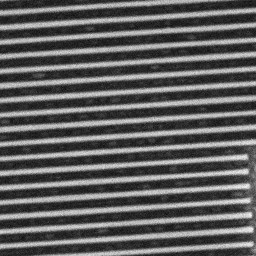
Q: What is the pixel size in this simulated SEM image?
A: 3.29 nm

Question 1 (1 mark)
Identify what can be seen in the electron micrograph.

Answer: parallel lines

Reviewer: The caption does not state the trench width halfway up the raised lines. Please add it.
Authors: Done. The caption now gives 32.8 nanometres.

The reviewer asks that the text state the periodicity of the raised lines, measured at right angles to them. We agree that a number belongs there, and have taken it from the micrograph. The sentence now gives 14.6 pixels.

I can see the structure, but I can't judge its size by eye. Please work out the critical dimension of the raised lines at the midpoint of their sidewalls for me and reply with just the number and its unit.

4.5 px